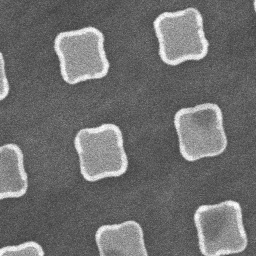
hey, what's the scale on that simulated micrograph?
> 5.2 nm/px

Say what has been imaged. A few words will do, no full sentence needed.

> raised bodies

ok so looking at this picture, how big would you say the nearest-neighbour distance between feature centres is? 510 nanometres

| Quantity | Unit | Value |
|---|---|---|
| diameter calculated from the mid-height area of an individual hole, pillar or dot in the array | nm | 280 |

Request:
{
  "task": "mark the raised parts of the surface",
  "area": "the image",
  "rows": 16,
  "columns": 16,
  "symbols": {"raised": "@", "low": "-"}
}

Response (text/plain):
----------------
----------@@@---
----@@----@@@---
----@@@---@@@---
----@@@---------
----------------
----------------
-----------@@@--
-----@@@---@@@--
@----@@@---@@@--
@----@@@--------
@@--------------
----------------
------------@@@-
------@@@---@@@-
@@----@@@----@@-